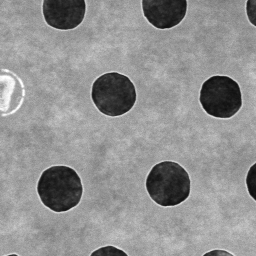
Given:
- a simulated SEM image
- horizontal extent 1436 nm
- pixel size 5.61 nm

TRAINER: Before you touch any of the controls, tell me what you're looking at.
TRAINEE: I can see holes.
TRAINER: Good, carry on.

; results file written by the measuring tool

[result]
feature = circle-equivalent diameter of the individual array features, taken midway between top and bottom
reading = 248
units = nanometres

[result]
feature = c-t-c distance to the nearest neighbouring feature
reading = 0.578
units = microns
